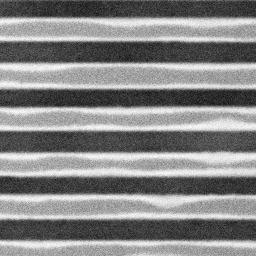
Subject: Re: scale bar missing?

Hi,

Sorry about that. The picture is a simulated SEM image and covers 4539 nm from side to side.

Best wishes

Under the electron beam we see lines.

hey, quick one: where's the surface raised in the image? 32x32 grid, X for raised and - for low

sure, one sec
--------------------------------
--------------------------------
-XXXXXXXXXXXX------------------X
XXXXXXXXXXXXXXXXXXXXXXXXXXXXXXXX
XXXXXXXXXXXXXXXXXXXXXXXXXXXXXXXX
--------------------------------
--------------------------------
--------------------------------
XXXXXXXXXXXXXXXXXXXXXXXXXXXXXXXX
XXXXXXXXXXXXXXXXXXXXXXXXXXXXXXXX
XXXXXXXXXXXXXXXXXXXXXXXXXXXXXXXX
--------------------------------
--------------------------------
--------------------------------
XXXXXXXXXXXXXXXXXXXXXXXXXXXXXXXX
XXXXXXXXXXXXXXXXXXXXXXXXXXXXXXXX
--------------------------------
--------------------------------
--------------------------------
XXXXXXXXXXXXXXXXXXXXXXXXXXXXXXXX
XXXXXXXXXXXXXXXXXXXXXXXXXXXXXXXX
XXXXXXXXXXXXXXXXXXXXXXXXXXXXXXXX
--------------------------------
--------------------------------
XX----XX-XXXXXXXX---------XXXXXX
XXXXXXXXXXXXXXXXXXXXXXXXXXXXXXXX
XXXXXXXXXXXXXXXXXXXXXXXXXXXXXXXX
--------------------------------
--------------------------------
--------------------------------
XXXXXXXXXXXXXXXXXXXXXXXXXXXXXXXX
XXXXXXXXXXXXXXXXXXXXXXXXXXXXXXXX